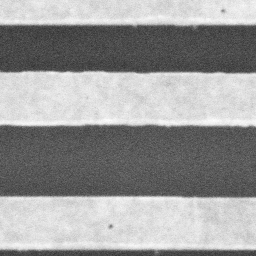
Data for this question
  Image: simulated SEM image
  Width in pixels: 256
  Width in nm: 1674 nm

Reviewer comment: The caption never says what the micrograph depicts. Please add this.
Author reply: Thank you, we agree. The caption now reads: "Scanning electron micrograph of lines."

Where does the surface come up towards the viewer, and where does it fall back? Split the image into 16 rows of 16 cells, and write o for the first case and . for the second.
oooooooooooooooo
..o...........o.
................
................
................
oooooooooooooooo
oooooooooooooooo
oooooooooooooooo
................
................
................
................
oooooooooooooooo
oooooooooooooooo
oooooooooooooooo
oooooooooooooooo